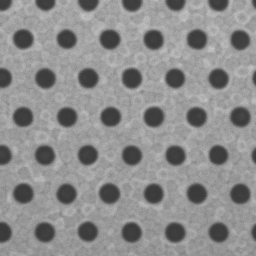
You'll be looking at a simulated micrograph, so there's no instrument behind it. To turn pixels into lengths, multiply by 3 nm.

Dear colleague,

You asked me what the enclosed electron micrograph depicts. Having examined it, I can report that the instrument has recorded a regular array of holes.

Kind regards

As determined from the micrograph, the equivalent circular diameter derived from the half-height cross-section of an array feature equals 56.6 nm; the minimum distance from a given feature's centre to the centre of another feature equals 129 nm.